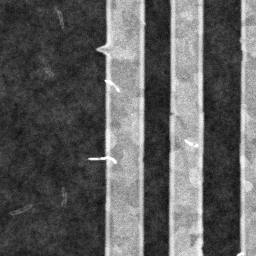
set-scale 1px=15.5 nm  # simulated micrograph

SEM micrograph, one or a few lines or trenches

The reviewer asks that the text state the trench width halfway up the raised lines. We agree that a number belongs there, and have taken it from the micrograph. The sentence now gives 566 nm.